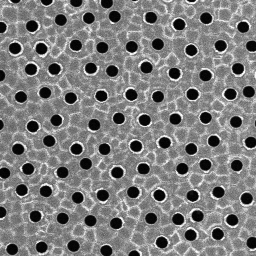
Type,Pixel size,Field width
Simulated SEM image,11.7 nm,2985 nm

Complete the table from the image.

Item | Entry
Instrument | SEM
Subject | a regular array of holes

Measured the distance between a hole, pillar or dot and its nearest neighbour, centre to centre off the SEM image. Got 290 nanometers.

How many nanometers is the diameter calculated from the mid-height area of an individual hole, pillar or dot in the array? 134